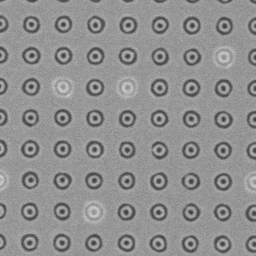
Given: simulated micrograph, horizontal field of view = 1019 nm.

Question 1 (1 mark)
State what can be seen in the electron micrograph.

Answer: a regular array of ring-shaped grooves with a dot in the middle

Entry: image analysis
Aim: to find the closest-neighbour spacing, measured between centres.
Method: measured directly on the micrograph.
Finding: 0.124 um